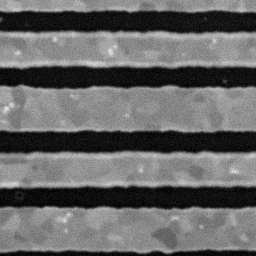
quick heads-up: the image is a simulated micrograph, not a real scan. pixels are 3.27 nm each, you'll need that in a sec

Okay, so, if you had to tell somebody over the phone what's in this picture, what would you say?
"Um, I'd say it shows lines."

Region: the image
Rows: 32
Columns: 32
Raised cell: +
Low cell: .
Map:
++++++++++++++++++++++++++++++++
................................
................................
................................
++++++++++++++++++++++++++++++++
++++++++++++++++++++++++++++++++
++++++++++++++++++++++++++++++++
++++++++++++++++++++++++++++++++
................................
................................
................................
++++++++++++++++++++++++++++++++
++++++++++++++++++++++++++++++++
++++++++++++++++++++++++++++++++
++++++++++++++++++++++++++++++++
++++++++++++++++++++++++++++++++
................................
................................
................................
++++++++++++++++++++++++++++++++
++++++++++++++++++++++++++++++++
++++++++++++++++++++++++++++++++
++++++++++++++++++++++++++++++++
................................
................................
................................
++++++++++++++++++++++++++++++++
++++++++++++++++++++++++++++++++
++++++++++++++++++++++++++++++++
++++++++++++++++++++++++++++++++
++++++++++++++++++++++++++++++++
.................++.++..........